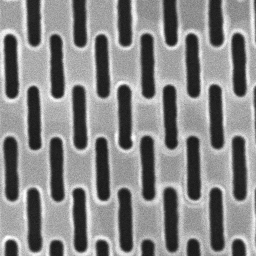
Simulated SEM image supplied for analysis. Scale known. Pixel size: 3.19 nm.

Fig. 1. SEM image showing a regular array of holes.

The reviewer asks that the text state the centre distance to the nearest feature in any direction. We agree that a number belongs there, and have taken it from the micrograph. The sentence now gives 145 nanometres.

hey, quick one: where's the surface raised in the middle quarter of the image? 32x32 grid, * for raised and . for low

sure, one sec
********...********....*******..
********...********....********.
********...********....********.
********....*******....********.
********....*******....********.
***..***....**..***....**..****.
**...***....*....**....**...***.
**...***...**....***...**...***.
**....***.***....***..***...****
**....*******....********...****
**....*******....********...****
**....*******....********...****
**....*******....********...****
**....********...********...****
**....********...********...****
**....*******....********...****
**....*******....********...****
**....********...********....***
**....**..****...**...***...***.
**....**...***...**....**....*..
***...**...***...**....**...***.
********...****.***....********.
********...********....********.
********...********....********.
********...********....********.
********...********....*******..
********...********....********.
********...*********...********.
********...********....********.
********...********....********.
********...*********...********.
**...***....**..****...**...***.